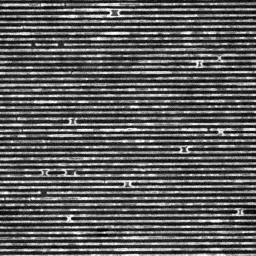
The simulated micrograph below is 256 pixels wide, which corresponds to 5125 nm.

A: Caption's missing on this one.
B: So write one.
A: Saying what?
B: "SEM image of parallel lines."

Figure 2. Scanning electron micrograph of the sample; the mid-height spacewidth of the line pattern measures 4.25 px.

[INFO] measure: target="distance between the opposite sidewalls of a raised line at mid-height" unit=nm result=30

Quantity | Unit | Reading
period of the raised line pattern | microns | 0.114